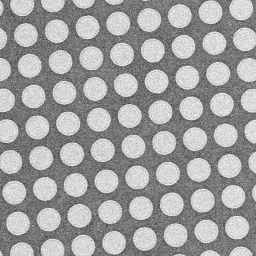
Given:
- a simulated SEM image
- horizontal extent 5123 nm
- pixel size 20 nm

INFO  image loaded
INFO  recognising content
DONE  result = an array of small figures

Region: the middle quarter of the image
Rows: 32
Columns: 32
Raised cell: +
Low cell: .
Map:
++...++++.......................
+............................+++
.....................++++...++++
.......+.....+++++..++++++..++++
+.....++++...+++++..++++++..++++
++...+++++...+++++...+++++...+++
+++..++++++..+++++...++++.......
+++..+++++....+++...............
+++...++++.....................+
++.....................++.....++
...............+++....+++++..+++
.......+++....+++++..++++++..+++
+++...+++++...+++++..++++++..+++
++++..+++++...+++++...+++++...++
++++..+++++...+++++....+++......
++++..+++++....+++..............
+++.....++.....................+
++.....................++++...++
...............++++...++++++..++
........++++...+++++..++++++..++
++++...+++++...+++++..++++++...+
+++++..++++++..+++++...++++.....
+++++..+++++...++++.....+.......
+++++..+++++....................
++++............................
........................++++...+
................++++...++++++..+
..++....+++++...+++++..++++++..+
.++++...+++++..++++++..++++++...
++++++..+++++...+++++...++++....
++++++..+++++...++++............
+++++....+++....................